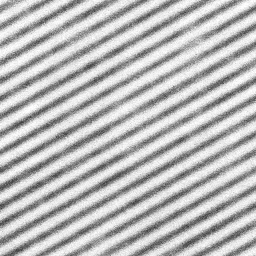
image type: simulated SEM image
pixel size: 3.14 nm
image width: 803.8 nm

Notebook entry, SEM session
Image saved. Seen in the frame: parallel lines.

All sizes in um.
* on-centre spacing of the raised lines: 0.049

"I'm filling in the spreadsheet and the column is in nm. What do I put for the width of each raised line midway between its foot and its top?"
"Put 19.1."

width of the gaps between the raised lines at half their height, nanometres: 30.4